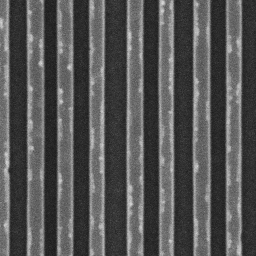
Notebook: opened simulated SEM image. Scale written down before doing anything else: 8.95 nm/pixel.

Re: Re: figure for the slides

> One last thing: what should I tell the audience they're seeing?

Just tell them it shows parallel lines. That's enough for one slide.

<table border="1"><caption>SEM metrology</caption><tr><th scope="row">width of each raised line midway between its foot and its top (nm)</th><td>126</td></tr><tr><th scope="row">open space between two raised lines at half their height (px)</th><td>17.9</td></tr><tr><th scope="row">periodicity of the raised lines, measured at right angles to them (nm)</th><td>296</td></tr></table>